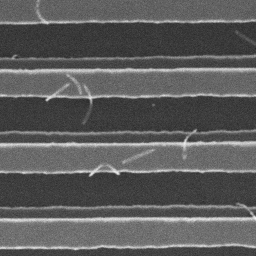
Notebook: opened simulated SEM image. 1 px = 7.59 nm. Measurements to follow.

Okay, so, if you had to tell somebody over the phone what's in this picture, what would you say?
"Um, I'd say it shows lines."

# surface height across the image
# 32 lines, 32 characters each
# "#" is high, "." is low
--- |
################################
################################
################################
................................
................................
................................
................................
................................
................................
################################
################################
################################
................................
................................
................................
................................
................................
................................
################################
################################
################################
###############.###......#..#...
................................
................................
................................
................................
................................
################################
################################
################################
################################
................................